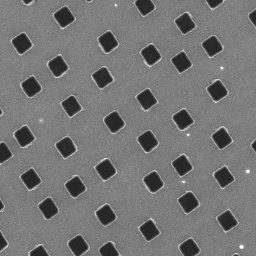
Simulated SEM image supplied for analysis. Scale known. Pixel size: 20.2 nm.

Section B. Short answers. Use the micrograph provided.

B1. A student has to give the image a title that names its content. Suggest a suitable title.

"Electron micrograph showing a regular array of raised bodies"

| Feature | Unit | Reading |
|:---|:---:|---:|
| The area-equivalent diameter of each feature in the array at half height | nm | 415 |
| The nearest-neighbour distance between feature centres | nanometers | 769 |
